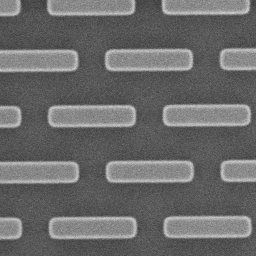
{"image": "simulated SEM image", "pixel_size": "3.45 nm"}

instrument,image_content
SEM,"groups of lines, slits or small figures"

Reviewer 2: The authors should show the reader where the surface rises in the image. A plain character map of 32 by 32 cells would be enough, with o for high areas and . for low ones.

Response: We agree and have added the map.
oo....ooooooooooo...ooooooooooo.
oo....ooooooooooo....oooooooooo.
................................
................................
................................
................................
ooooooooo.....oooooooooo....oooo
oooooooooo...ooooooooooo....oooo
oooooooooo...ooooooooooo....oooo
................................
................................
................................
................................
oo....ooooooooooo....oooooooooo.
oo....ooooooooooo...ooooooooooo.
oo....ooooooooooo....oooooooooo.
................................
................................
................................
................................
ooooooooo.....oooooooooo....oooo
oooooooooo...ooooooooooo....oooo
ooooooooo.....oooooooooo....oooo
................................
................................
................................
................................
oo....ooooooooooo....oooooooooo.
ooo...ooooooooooo....oooooooooo.
oo....ooooooooooo....oooooooooo.
................................
................................